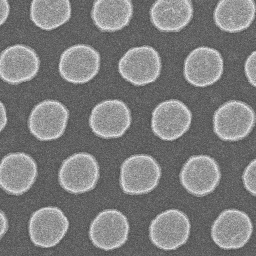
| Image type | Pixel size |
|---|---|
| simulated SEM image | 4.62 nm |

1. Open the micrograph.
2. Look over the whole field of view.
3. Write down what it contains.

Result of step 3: a regular array of raised bodies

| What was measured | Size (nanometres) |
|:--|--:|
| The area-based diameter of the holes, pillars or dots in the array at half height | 182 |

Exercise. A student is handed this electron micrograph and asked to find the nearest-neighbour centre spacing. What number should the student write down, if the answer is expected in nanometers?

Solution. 281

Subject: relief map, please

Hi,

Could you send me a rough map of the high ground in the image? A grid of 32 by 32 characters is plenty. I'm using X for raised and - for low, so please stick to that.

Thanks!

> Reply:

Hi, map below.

X---XXXXX---XXXX---XXXXX---XXXXX
X---XXXXX---XXXX---XXXXX---XXXXX
X---XXXX----XXXX---XXXXX---XXXXX
-----XX------XX-----XXX-----XXX-
--------------------------------
--------------------------------
XXXX----XXXX----XXX-----XXX-----
XXXXX---XXXX---XXXXX---XXXXX---X
XXXXX--XXXXX---XXXXX---XXXXX---X
XXXX----XXXX---XXXXX---XXXX----X
-----------------X------XX------
--------------------------------
--------------------------------
----XXXX----XXXX----XXX-----XXX-
X---XXXX---XXXXX---XXXXX---XXXXX
X---XXXX---XXXXX---XXXXX---XXXXX
----XXXX----XXXX---XXXX----XXXX-
----------------------------X---
--------------------------------
-XX------XX------X--------------
XXXX----XXXX---XXXXX---XXXX----X
XXXXX--XXXXX---XXXXX---XXXX----X
XXXX---XXXXX---XXXXX---XXXX---XX
XXXX----XXX----XXXX----XXXX----X
--------------------------------
--------------------------------
-----XXX-----XX------XX-----XX--
X---XXXX----XXXX---XXXX----XXXX-
X---XXXX---XXXXX---XXXXX---XXXX-
----XXXX---XXXXX---XXXXX--XXXXX-
----XXX-----XXX----XXXX----XXXX-
--------------------------------